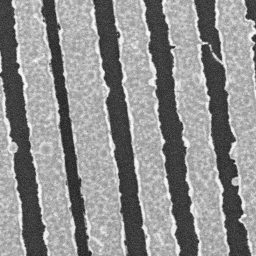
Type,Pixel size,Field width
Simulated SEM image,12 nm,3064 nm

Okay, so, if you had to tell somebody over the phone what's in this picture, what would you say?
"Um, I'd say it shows parallel lines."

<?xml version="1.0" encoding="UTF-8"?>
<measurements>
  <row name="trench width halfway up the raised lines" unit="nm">249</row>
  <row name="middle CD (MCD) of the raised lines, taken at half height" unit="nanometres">362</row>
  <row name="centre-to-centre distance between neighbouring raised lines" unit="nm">602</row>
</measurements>